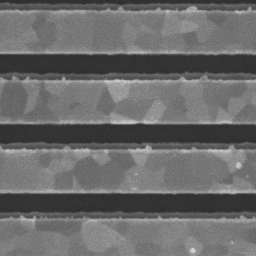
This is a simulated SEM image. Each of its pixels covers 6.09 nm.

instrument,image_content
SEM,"lines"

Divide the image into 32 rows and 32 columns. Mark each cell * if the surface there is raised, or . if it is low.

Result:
*...............................
********************************
********************************
********************************
********************************
********************************
********************************
................................
................................
********************************
********************************
********************************
********************************
********************************
********************************
...............................*
................................
................................
********************************
********************************
********************************
********************************
********************************
********************************
................................
................................
................................
********************************
********************************
********************************
********************************
********************************